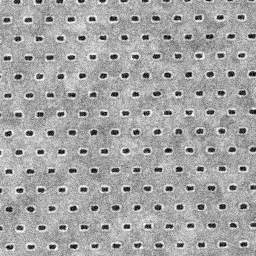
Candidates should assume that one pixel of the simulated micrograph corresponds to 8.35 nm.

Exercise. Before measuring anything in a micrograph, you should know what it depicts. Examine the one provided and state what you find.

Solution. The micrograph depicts a regular array of holes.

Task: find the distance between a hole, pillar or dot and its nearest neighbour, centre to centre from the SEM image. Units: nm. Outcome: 176